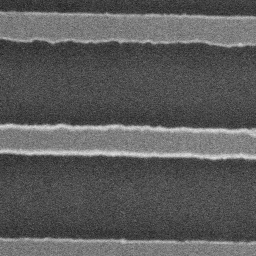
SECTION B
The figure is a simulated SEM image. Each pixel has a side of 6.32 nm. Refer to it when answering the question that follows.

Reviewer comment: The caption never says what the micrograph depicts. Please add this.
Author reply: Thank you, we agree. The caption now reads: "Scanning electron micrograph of lines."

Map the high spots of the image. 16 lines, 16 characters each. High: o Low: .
................
oooooooooooooooo
.ooooooooooooooo
................
................
................
................
................
oooooooooooooooo
oooooooooooooooo
................
................
................
................
................
oooooooooooooooo